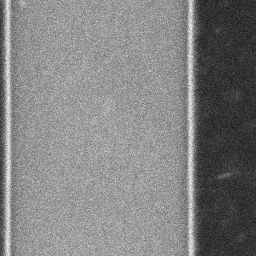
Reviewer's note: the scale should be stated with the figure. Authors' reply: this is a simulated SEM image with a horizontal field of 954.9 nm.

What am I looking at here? one or a few lines or trenches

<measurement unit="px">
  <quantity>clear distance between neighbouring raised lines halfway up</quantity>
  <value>180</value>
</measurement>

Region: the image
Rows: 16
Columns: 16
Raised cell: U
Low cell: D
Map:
UDDDDDDDDDDDUUUU
UDDDDDDDDDDDUUUU
UDDDDDDDDDDDUUUU
UDDDDDDDDDDDUUUU
UDDDDDDDDDDDUUUU
UDDDDDDDDDDDUUUU
UDDDDDDDDDDDUUUU
UDDDDDDDDDDDUUUU
UDDDDDDDDDDDUUUU
UDDDDDDDDDDDUUUU
UDDDDDDDDDDDUUUU
UDDDDDDDDDDDUUUU
UDDDDDDDDDDDUUUU
UDDDDDDDDDDDUUUU
UDDDDDDDDDDDUUUU
UDDDDDDDDDDDUUUU